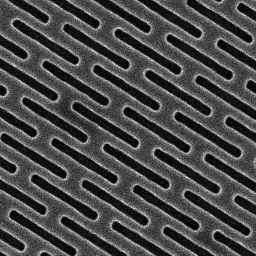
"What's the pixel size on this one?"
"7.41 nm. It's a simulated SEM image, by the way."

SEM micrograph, a regular array of holes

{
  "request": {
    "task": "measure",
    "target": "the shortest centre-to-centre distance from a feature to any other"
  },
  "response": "311 nanometers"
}